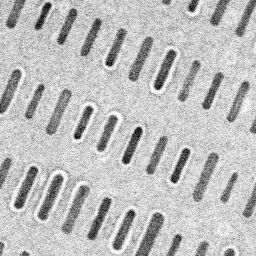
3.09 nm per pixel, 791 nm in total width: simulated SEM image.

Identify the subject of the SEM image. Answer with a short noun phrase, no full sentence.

a regular array of holes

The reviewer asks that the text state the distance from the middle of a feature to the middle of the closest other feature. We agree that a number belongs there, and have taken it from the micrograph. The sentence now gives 80.6 nm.